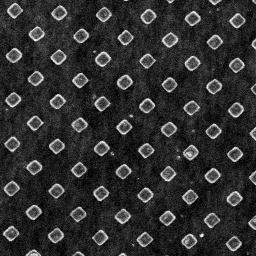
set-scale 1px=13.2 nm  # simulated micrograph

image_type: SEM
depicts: a regular array of raised bodies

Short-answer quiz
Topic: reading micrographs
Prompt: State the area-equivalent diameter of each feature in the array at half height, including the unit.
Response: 173 nm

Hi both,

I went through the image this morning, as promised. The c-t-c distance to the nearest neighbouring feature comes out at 410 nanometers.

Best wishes